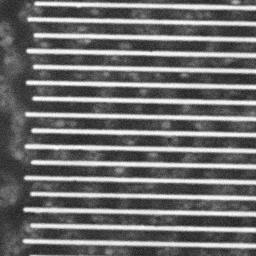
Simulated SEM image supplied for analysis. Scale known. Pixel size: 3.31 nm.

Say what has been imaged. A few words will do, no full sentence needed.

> parallel lines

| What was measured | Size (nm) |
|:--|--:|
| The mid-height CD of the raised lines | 11.6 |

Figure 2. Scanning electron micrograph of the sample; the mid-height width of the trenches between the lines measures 41.3 nm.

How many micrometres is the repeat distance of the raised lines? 0.0524